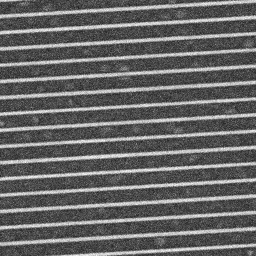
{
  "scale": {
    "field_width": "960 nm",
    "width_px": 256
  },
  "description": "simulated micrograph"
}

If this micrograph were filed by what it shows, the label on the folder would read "parallel lines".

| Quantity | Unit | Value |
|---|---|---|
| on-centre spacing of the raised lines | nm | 60.8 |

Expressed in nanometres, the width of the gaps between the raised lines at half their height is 49.1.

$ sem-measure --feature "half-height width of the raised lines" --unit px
2.99